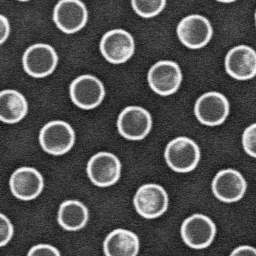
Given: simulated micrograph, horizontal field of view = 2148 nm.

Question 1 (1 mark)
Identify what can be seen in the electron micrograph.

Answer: a regular array of raised bodies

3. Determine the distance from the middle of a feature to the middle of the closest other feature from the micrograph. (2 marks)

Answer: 54.9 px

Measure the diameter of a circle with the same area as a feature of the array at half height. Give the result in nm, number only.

262